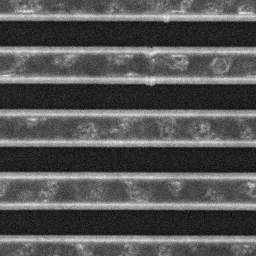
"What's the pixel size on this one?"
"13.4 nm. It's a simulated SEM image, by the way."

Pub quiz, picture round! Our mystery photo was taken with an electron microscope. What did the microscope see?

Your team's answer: parallel lines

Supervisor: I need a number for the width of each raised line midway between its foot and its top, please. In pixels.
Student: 31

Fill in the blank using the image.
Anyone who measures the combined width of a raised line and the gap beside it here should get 845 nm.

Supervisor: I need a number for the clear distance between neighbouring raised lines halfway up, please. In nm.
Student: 427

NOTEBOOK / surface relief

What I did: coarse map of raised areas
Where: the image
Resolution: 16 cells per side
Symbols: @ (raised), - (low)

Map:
@@@@@@@@@@@@@@@@
----------------
----------------
@@@@@@@@@@@@@@@@
@@@@@@@@@@@@@@@@
----------------
----------------
@@@@@@@@@@@@@@@@
@@@@@@@@@@@@@@@@
----------------
----------------
@@@@@@@@@@@@@@@@
@@@@@@@@@@@@@@@@
----------------
----------------
@@@@@@@@@@@@@@@@